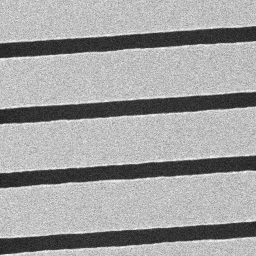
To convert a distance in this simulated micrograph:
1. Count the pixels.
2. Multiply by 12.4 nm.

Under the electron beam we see lines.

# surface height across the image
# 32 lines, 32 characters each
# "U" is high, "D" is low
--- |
UUUUUUUUUUUUUUUUUUUUUUUUUUUUUUUU
UUUUUUUUUUUUUUUUUUUUUUUUUUUUUUUU
UUUUUUUUUUUUUUUUUUUUUUUUUUUUUUUU
UUUUUUUUUUUUUUUUUUUUUUUUUUUUDDDD
UUUUUUUUUUUUUDDDDDDDDDDDDDDDDDDD
DDDDDDDDDDDDDDDDDDDDDDDDDDDUUUUU
DDDDDDDDDDDDUUUUUUUUUUUUUUUUUUUU
UUUUUUUUUUUUUUUUUUUUUUUUUUUUUUUU
UUUUUUUUUUUUUUUUUUUUUUUUUUUUUUUU
UUUUUUUUUUUUUUUUUUUUUUUUUUUUUUUU
UUUUUUUUUUUUUUUUUUUUUUUUUUUUUUUU
UUUUUUUUUUUUUUUUUUUUUUUUUUUUUUDD
UUUUUUUUUUUUUUUUDDDDDDDDDDDDDDDD
UUDDDDDDDDDDDDDDDDDDDDDDDDDDDDUU
DDDDDDDDDDDDDDDDDUUUUUUUUUUUUUUU
DUUUUUUUUUUUUUUUUUUUUUUUUUUUUUUU
UUUUUUUUUUUUUUUUUUUUUUUUUUUUUUUU
UUUUUUUUUUUUUUUUUUUUUUUUUUUUUUUU
UUUUUUUUUUUUUUUUUUUUUUUUUUUUUUUU
UUUUUUUUUUUUUUUUUUUUUUUUUUUUUUDD
UUUUUUUUUUUUUUUUDDDDDDDDDDDDDDDD
UUDDDDDDDDDDDDDDDDDDDDDDDDDDDDUU
DDDDDDDDDDDDDDDDUUUUUUUUUUUUUUUU
DDUUUUUUUUUUUUUUUUUUUUUUUUUUUUUU
UUUUUUUUUUUUUUUUUUUUUUUUUUUUUUUU
UUUUUUUUUUUUUUUUUUUUUUUUUUUUUUUU
UUUUUUUUUUUUUUUUUUUUUUUUUUUUUUUU
UUUUUUUUUUUUUUUUUUUUUUUUUUUUUUUU
UUUUUUUUUUUUUUUUUUUUDDDDDDDDDDDD
UUUUUUDDDDDDDDDDDDDDDDDDDDDDDDDD
DDDDDDDDDDDDDDDDDDDUUUUUUUUUUUUU
DDDDUUUUUUUUUUUUUUUUUUUUUUUUUUUU